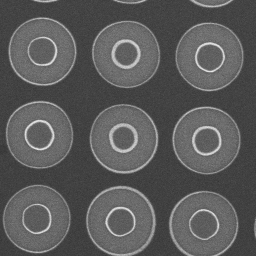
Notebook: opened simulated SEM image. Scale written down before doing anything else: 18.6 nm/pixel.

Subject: an array of small figures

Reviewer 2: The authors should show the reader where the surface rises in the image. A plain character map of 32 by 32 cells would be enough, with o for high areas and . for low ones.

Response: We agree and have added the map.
ooooooooooooooooooooooooo...oooo
oooooooooooooooooooooooooooooooo
oooo..oooooooooooooooooooooooooo
oo......ooooo.....oooooo....oooo
oo.......ooo.......oooo......ooo
o...ooo..ooo...oo...oo....o...oo
o...ooo..ooo..ooo...oo...ooo..oo
o...ooo..ooo..ooo...oo...ooo..oo
oo.......ooo........oo...oo...oo
ooo.....ooooo......oooo.......oo
ooooo.oooooooo....oooooo....oooo
oooooooooooooooooooooooooooooooo
oooooooooooooooooooooooooooooooo
oo.....ooooooo...oooooooo..ooooo
oo......oooo.......oooo......ooo
o...oo...ooo.......ooo.......ooo
o..oooo..oo...ooo...oo...oo...oo
o..oooo..oo...ooo...oo..ooo...oo
o...oo...oo...oo....oo..ooo...oo
oo......oooo.......ooo.......ooo
ooo....oooooo.....ooooo......ooo
ooooooooooooooo.ooooooooo..ooooo
oooooooooooooooooooooooooooooooo
ooo...oooooooo..oooooooooooooooo
oo......oooo......oooooo...ooooo
o.......ooo........ooo.......ooo
o..ooo...oo...oo...ooo...o...ooo
...ooo...oo..oooo..oo...ooo...oo
o..ooo...oo...ooo..oo...ooo...oo
o.......ooo........ooo...oo..ooo
oo.....ooooo......oooo.......ooo
oooo.oooooooo....oooooo.....oooo